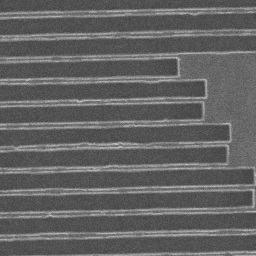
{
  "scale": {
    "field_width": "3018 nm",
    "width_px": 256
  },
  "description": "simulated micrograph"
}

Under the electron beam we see parallel lines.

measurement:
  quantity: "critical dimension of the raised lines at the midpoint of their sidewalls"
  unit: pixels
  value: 5.75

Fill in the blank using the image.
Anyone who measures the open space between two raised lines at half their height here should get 195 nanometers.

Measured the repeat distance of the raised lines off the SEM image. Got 0.261 microns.